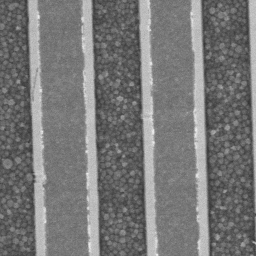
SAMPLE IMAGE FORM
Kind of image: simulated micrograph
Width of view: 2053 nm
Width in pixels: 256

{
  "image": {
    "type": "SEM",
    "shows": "one or a few lines or trenches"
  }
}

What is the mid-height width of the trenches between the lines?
445 nanometres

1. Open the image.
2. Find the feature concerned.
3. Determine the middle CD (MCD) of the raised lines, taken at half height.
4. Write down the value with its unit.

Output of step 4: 437 nm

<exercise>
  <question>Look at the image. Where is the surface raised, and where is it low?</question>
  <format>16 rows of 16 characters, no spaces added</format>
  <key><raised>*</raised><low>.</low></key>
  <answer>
..***....***....
..***....***....
..****...***....
..****...***....
..****...***....
..****...***....
..****...****...
..****...****...
..****...****...
..****...****...
..****...****...
..****...****...
..****...****...
..****...****...
..****...****...
...***...****...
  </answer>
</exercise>